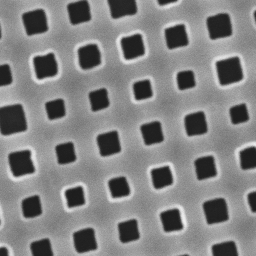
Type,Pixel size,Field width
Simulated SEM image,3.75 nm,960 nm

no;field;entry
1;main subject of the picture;a regular array of holes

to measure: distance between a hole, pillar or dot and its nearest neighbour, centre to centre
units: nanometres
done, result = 166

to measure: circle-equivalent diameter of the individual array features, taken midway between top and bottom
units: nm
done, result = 87.2